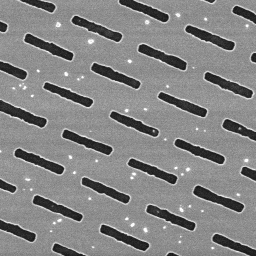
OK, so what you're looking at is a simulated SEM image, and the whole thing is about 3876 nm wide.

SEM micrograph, a regular array of holes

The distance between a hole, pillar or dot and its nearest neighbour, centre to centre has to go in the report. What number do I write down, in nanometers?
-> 761